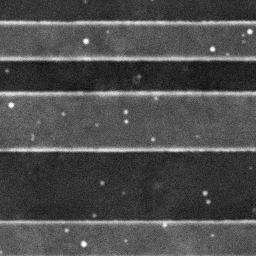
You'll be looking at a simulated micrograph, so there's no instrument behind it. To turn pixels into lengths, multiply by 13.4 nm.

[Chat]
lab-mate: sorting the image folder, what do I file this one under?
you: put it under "lines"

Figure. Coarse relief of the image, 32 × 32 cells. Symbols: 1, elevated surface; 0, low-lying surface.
00000000000000000000000000000000
00000000000000000000000000000000
00000000000000000000000000000000
11111111111111111111111111111111
11111111111111111111111111111111
11111111111111111111111111111111
11111111111111111111111111111111
00000000000000000000000000000000
00000000000000000000000000000000
00000000000000000000000000000000
00000000000000000000000000000000
00000000000000000000000000000000
11111111111111111111111111111111
11111111111111111111111111111111
11111111111111111111111111111111
11111111111111111111111111111111
11111111111111111111111111111111
11111111111111111111111111111111
11111111111111111111111111111111
00000000000000000000000000000000
00000000000000000000000000000000
00000000000000000000000000000000
00000000000000000000000000000000
00000000000000000000000000000000
00000000000000000000000000000000
00000000000000000000000000000000
00000000000000000000000000000000
00000000000000000000000000000000
11111111111111111111111111111111
11111111111111111111111111111111
11111111111111111111111111111111
11111111111111111111111111111111